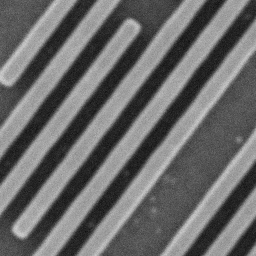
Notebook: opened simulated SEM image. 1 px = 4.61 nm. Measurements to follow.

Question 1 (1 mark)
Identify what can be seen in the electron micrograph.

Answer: groups of lines, slits or small figures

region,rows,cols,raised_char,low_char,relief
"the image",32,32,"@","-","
-------@@---@@---------@@---@@@-
------@@---@@@--------@@---@@@--
-----@@@--@@@--------@@@---@@---
----@@@---@@---@@---@@@---@@---@
----@@---@@---@@@---@@---@@@---@
---@@---@@@---@@---@@---@@@---@@
--@@@--@@@---@@---@@@---@@---@@-
-@@@---@@---@@@--@@@---@@---@@@-
@@@---@@---@@@---@@---@@---@@@--
@@---@@@---@@---@@---@@@---@@---
----@@@---@@---@@@---@@---@@----
----@@---@@@--@@@---@@---@@@----
---@@---@@@---@@---@@@--@@@-----
--@@@---@@---@@---@@@---@@------
-@@@---@@---@@@--@@@---@@-------
-@@---@@---@@@---@@---@@@-------
@@---@@@---@@---@@@--@@@--------
@@--@@@---@@---@@@---@@--------@
@---@@---@@@--@@@---@@--------@@
---@@---@@@---@@---@@@--------@@
--@@@---@@---@@---@@@--------@@-
-@@@---@@---@@@---@@--------@@@-
-@@---@@@---@@---@@--------@@@--
@@---@@@---@@---@@@--------@@---
@@---@@---@@---@@@--------@@---@
@---@@---@@@---@@--------@@@--@@
---@@@--@@@---@@--------@@@---@@
--@@@---@@---@@@--------@@---@@@
--@@---@@---@@@--------@@---@@@-
------@@@--@@@--------@@@---@@--
-----@@@---@@--------@@@---@@---
-----@@---@@---------@@---@@---@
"